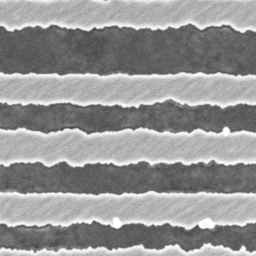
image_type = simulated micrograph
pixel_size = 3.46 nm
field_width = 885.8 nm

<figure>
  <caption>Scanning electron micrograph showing lines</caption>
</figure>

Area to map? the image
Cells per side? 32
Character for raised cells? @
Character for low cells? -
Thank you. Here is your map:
@@@@@@@@@@@@@@@@@@@@@@@@@@@@@@@@
@@@@@@@@@@@@@@@@@@@@@@@@@@@@@@@@
@@@@@@@@@@@@@@@@@@@@@@@@@@@@@@@@
-@@------@@@@----@-@@----@---@@@
--------------------------------
--------------------------------
--------------------------------
--------------------------------
--------------------------------
@@@@@@@@@@@@@@@@@@@@@@@@@@@@@@-@
@@@@@@@@@@@@@@@@@@@@@@@@@@@@@@@@
@@@@@@@@@@@@@@@@@@@@@@@@@@@@@@@@
@@@@@@@@@@@@@@@@@@@@@-@@@@@@@@@@
--------------------------------
--------------------------------
--------------------------------
@@@@@--@@@---@@@@@@@----@@--@@@-
@@@@@@@@@@@@@@@@@@@@@@@@@@@@@@@@
@@@@@@@@@@@@@@@@@@@@@@@@@@@@@@@@
@@@@@@@@@@@@@@@@@@@@@@@@@@@@@@@@
@----@@--@@---@@-------@----@@--
--------------------------------
--------------------------------
--------------------------------
@@@@@@@@@@@@@@@@@@@@@@@@@@@@@@@@
@@@@@@@@@@@@@@@@@@@@@@@@@@@@@@@@
@@@@@@@@@@@@@@@@@@@@@@@@@@@@@@@@
@@@@@@@@@@@@@@@@@@@@@@@@@@@@@@@@
-----------------------@-@------
--------------------------------
--------------------------------
@@@@@@@@@@@@@@@@@@@@@@@@@@@@@@@-